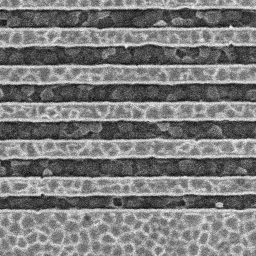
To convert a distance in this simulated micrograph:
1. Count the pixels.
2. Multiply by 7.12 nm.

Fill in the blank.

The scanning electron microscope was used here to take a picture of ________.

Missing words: parallel lines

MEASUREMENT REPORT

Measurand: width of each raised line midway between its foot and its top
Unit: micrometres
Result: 0.115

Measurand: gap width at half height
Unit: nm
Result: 146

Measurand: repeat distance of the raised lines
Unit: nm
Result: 266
